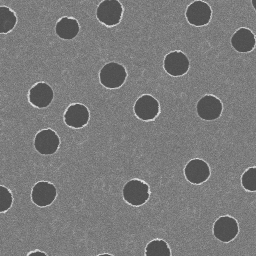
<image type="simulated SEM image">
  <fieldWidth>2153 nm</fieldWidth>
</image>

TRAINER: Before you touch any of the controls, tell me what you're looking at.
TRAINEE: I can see a regular array of holes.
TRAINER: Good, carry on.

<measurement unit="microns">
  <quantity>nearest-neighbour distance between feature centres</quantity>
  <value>0.447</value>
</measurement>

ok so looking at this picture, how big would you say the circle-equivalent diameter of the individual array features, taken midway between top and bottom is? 207 nm